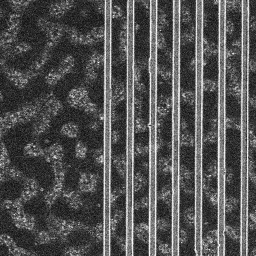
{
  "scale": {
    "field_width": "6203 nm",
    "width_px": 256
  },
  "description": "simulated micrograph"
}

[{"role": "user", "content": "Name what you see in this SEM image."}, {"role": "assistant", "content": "parallel lines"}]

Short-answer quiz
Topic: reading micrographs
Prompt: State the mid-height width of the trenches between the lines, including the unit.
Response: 127 nm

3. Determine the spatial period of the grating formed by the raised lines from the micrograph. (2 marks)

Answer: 0.555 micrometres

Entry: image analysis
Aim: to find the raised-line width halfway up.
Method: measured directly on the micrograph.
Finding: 421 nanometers